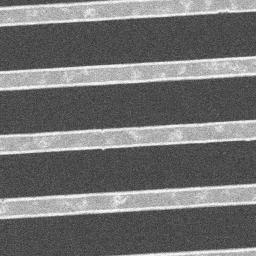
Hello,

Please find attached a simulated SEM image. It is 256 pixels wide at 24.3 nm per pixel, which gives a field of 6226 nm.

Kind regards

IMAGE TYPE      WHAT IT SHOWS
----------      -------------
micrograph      parallel lines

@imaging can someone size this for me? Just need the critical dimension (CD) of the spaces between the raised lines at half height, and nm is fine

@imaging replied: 1150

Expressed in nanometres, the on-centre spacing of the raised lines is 1560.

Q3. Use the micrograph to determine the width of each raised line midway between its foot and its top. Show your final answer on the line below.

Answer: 398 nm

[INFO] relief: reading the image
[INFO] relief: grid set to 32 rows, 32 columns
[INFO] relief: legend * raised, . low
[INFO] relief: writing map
..........**********************
***************************.....
**********......................
................................
................................
................................
................................
..........................******
...........*********************
***************************.....
***********.....................
................................
................................
................................
................................
..........................******
...........*********************
****************************....
***********.....................
................................
................................
................................
................................
...........................*****
..........**********************
**************************.*....
**********......................
................................
................................
................................
................................
..........................******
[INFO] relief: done